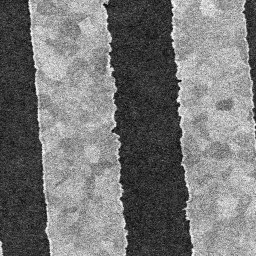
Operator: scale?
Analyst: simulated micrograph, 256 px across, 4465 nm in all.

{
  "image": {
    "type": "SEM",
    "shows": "one or a few lines or trenches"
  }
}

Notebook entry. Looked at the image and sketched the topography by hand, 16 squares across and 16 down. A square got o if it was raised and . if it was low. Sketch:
..ooooo....oooo.
..ooooo....oooo.
..ooooo....oooo.
..ooooo....ooooo
..ooooo....ooooo
..ooooo....ooooo
..ooooo....ooooo
..ooooo....ooooo
...oooo....ooooo
...oooo....ooooo
...oooo.....oooo
...ooooo....oooo
...ooooo....oooo
...ooooo....oooo
...ooooo....oooo
...ooooo....oooo